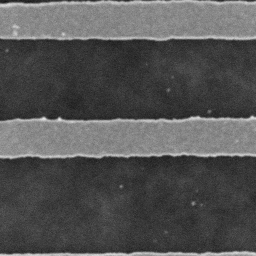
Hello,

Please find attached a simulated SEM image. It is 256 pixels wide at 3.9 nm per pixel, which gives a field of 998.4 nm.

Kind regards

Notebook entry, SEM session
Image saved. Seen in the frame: lines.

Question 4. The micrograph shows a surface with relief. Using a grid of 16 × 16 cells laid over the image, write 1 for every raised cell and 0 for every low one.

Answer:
1111111111111111
1111111111111111
0000000000000000
0000000000000000
0000000000000000
0000000000000000
0000000000000000
0111000111111111
1111111111111111
1111111111111111
0000000000000000
0000000000000000
0000000000000000
0000000000000000
0000000000000000
0000000000000000